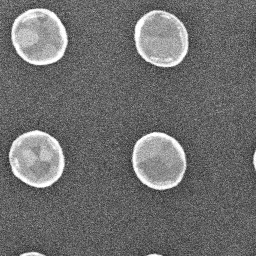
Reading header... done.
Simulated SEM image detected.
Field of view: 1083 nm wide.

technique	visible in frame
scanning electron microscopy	raised bodies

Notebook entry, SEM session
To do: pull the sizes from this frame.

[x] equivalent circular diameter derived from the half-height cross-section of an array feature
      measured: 224 nm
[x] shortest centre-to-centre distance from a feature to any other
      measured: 122 pixels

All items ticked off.